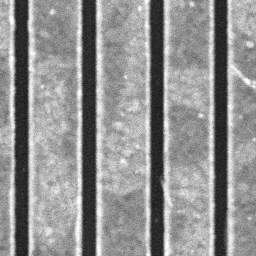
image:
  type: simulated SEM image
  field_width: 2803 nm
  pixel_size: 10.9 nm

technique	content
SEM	lines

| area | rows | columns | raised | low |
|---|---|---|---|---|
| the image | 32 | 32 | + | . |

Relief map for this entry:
++..++++++..+++++++..++++++..+++
+...++++++..+++++++..+++++...+++
++..++++++..+++++++..++++++..+++
++..++++++..+++++++..++++++..+++
++..++++++..+++++++..++++++..+++
++..++++++..+++++++..+++++...+++
++..++++++..+++++++..+++++...+++
++..++++++..+++++++..+++++...+++
++..++++++..+++++++..+++++...+++
++..++++++..+++++++..++++++..+++
++..++++++..+++++++..++++++..+++
++..++++++..+++++++..++++++..+++
++..++++++..+++++++..++++++..+++
++..++++++..+++++++..+++++...+++
++..++++++..+++++++..+++++...+++
++..++++++..+++++++..+++++...+++
++..++++++..+++++++..++++++..+++
++..++++++..+++++++..+++++...+++
++..++++++..+++++++..+++++...+++
++..++++++..+++++++..+++++...+++
++..++++++..+++++++..+++++...+++
++..++++++..+++++++..++++++..+++
++..++++++..+++++++..++++++..+++
++..++++++..+++++++..+++++...+++
++..++++++..+++++++..+++++...+++
++..++++++..+++++++..++++++..+++
++..++++++..+++++++..++++++..+++
++..++++++..+++++++..++++++..+++
++..++++++..+++++++..++++++..+++
++..++++++..+++++++..++++++..+++
++..++++++..+++++++..++++++..+++
++..++++++..+++++++..++++++..+++